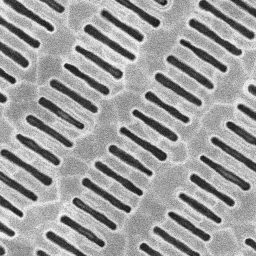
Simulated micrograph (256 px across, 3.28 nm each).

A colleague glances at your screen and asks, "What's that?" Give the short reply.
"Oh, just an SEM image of a regular array of holes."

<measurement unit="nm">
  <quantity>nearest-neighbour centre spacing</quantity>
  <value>69.9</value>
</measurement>